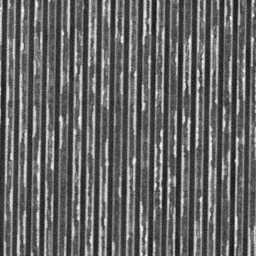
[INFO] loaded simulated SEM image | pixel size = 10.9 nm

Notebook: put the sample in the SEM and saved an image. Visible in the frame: parallel lines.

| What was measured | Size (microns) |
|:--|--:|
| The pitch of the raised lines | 0.148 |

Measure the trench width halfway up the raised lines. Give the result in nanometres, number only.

61.3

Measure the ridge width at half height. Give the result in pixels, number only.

8